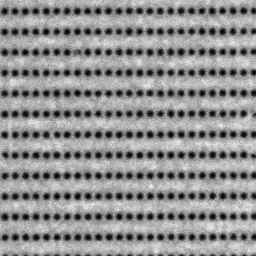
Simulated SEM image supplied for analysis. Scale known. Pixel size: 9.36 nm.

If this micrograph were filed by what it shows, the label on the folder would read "a regular array of holes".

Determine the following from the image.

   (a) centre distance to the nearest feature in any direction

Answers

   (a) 95.6 nanometers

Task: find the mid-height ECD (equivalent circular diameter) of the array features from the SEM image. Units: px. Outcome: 7.57